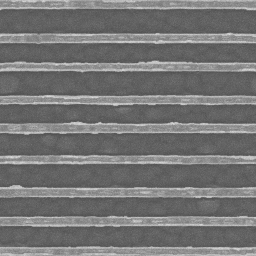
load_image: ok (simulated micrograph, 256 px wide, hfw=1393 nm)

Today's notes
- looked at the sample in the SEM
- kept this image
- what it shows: parallel lines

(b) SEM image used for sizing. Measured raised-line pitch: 166 nm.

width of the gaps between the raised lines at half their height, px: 21.8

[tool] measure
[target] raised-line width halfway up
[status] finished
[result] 0.0483 µm